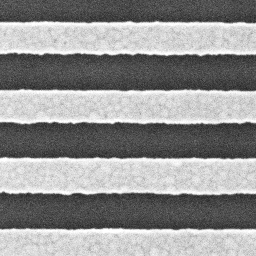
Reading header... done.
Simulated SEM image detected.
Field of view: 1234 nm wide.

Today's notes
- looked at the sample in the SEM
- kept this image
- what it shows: lines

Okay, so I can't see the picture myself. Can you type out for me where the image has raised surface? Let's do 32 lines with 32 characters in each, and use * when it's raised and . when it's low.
................................
................................
................................
********************************
********************************
********************************
********************************
................................
................................
................................
................................
***************.**************..
********************************
********************************
********************************
................................
................................
................................
................................
................................
********************************
********************************
********************************
********************************
................................
................................
................................
................................
................................
********************************
********************************
********************************